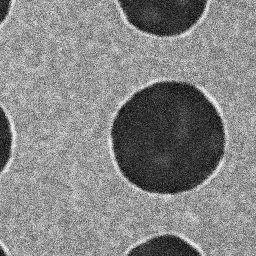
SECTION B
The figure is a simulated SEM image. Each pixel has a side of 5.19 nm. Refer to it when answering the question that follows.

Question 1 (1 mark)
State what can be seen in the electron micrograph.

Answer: holes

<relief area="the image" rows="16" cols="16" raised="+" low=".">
.++++++......+++
++++++++....++++
++++++++++++++++
++++++++++++++++
++++++++++++++++
+++++++++...++++
++++++++.....+++
.++++++.......++
.++++++.......++
.++++++.......++
+++++++.......++
++++++++.....+++
++++++++++++++++
++++++++++++++++
++++++++++++++++
++++++++....++++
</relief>